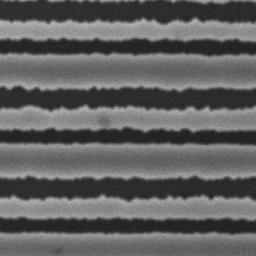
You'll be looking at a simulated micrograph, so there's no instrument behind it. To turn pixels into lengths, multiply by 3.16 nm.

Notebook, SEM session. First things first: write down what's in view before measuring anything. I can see lines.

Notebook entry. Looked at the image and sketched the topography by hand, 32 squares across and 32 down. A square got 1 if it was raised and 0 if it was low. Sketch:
00000000000000000000000000000000
00000000000000000000000000000000
00000000000000000000000010000000
11111111111111111111111111111111
11111111111111111111111111111111
00000000000000000000000000000000
00000000000000000000000000000000
11111111111111111111111111111111
11111111111111111111111111111111
11111111111111111111111111111111
11111111111111111111111111111111
00000000000000000000000000000000
00000000000000000000000000000000
00011000001001111000000000000001
11111111111111111111111111111111
11111111111111111111111111111111
00000000000000000000000000000000
00000000000000000000000000000000
11111111111111111111111111111111
11111111111111111111111111111111
11111111111111111111111111111111
11111111111111111111111111111111
00000000000000000000000000000000
00000000000000000000000000000000
00000000000000000000000000000000
11111111111111111111111111111111
11111111111111111111111111111111
00000000000000000000000000000001
00000000000000000000000000000000
11111111111111111111111111111111
11111111111111111111111111111111
11111111111111111111111111111111